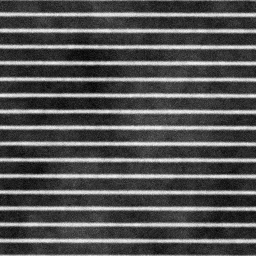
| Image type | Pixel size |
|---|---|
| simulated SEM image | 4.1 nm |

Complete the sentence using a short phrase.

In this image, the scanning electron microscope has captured parallel lines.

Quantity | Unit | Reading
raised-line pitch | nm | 66.2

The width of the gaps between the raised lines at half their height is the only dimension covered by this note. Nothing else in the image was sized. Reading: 55.8 nm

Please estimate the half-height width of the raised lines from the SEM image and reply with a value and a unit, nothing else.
0.0102 microns